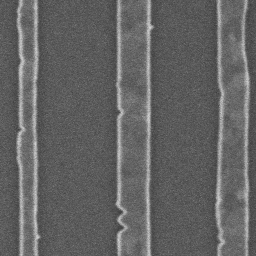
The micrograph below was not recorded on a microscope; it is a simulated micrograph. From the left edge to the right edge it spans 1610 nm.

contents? one or a few lines or trenches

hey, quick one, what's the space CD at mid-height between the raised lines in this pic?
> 0.482 microns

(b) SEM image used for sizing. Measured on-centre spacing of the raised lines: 644 nm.